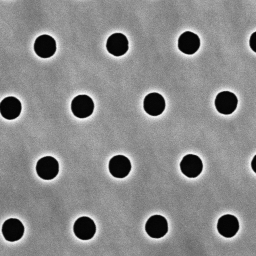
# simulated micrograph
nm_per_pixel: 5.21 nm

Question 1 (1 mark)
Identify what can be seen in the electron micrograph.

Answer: a regular array of holes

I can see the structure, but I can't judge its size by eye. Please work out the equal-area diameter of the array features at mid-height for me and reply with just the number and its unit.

0.121 µm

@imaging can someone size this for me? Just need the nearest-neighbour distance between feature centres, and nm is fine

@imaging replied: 367